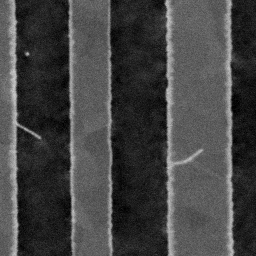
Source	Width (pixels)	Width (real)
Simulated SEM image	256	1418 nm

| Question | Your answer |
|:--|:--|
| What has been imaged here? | lines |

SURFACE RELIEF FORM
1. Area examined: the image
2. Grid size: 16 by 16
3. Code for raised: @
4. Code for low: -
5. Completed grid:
@---@@@---@@@@--
@---@@@---@@@@--
@---@@@---@@@@--
@---@@@---@@@@--
@---@@@---@@@@--
@---@@@---@@@@--
@---@@@---@@@@--
@---@@@---@@@@--
@---@@@----@@@--
@---@@@---@@@@--
@---@@@---@@@@--
@---@@@----@@@--
@---@@@----@@@--
@----@@----@@@--
@----@@----@@@--
@----@@----@@@@-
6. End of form